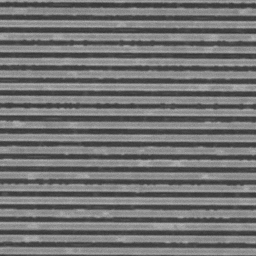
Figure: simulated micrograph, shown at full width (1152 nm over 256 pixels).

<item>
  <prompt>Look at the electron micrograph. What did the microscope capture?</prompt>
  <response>parallel lines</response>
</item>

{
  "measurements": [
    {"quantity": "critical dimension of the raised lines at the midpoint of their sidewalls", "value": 0.027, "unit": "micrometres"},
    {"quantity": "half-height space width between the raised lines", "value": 0.027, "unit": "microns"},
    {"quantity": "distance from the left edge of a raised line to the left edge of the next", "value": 12.6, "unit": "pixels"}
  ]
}